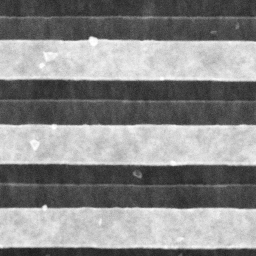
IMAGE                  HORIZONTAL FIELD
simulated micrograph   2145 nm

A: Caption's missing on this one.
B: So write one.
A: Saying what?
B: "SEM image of lines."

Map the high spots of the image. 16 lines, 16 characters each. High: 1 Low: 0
0000000000000000
0000000000000000
0000011000000000
1111111111111111
1111111111111111
0000000000000000
0000000000000000
0000000000000000
1111111111111111
1111111111111111
0000000000000000
0000000000000000
0000000000000000
1111111111111111
1111111111111111
0000001111111111